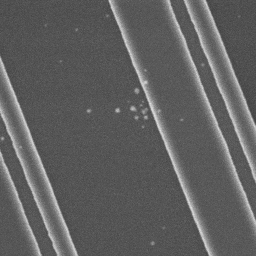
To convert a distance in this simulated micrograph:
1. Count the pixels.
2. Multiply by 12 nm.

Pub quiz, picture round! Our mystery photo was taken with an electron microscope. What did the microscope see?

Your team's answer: lines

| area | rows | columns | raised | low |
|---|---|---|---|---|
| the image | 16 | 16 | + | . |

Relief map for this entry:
.......++++++...
.......++++++...
........++++++..
........++++++..
.........++++++.
+........++++++.
+........++++++.
++........++++++
++........++++++
++.........+++++
+++........+++++
+++........+++++
+++.........++++
++++........++++
++++.........+++
+++++........+++